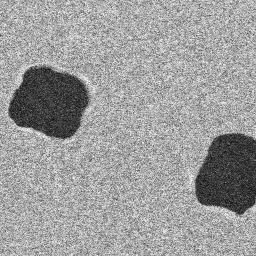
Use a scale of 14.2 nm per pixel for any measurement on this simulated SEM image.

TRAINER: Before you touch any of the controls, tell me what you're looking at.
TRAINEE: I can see holes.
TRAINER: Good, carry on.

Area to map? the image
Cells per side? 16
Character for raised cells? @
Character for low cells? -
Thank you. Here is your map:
@@@@@@@@@@@@@@@@
@@@@@@@@@@@@@@@@
@@@@@@@@@@@@@@@@
@@@@@@@@@@@@@@@@
@@--@@@@@@@@@@@@
@-----@@@@@@@@@@
@-----@@@@@@@@@@
@----@@@@@@@@@@@
@@@-@@@@@@@@@@--
@@@@@@@@@@@@@---
@@@@@@@@@@@@@---
@@@@@@@@@@@@----
@@@@@@@@@@@@----
@@@@@@@@@@@@@@@@
@@@@@@@@@@@@@@@@
@@@@@@@@@@@@@@@@